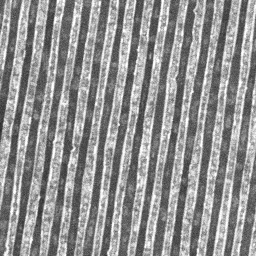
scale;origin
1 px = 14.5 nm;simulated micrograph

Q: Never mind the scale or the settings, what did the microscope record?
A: parallel lines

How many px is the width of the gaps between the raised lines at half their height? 8.79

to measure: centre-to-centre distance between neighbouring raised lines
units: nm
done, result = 251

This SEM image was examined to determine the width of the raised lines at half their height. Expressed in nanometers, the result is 113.